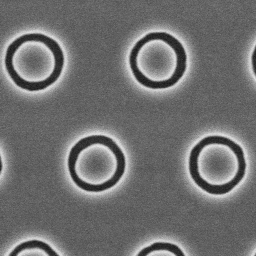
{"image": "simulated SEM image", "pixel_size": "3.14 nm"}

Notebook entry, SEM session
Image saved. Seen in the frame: ring-shaped grooves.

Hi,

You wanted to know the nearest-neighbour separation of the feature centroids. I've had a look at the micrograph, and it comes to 370 nm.